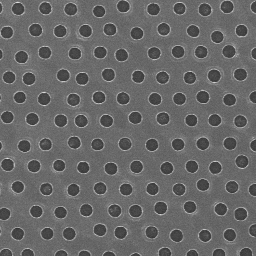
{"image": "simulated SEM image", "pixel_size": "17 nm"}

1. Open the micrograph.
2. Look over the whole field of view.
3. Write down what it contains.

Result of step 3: a regular array of holes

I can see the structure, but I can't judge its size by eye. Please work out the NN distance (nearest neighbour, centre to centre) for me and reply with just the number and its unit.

389 nanometres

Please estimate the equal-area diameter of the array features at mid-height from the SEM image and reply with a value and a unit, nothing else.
214 nm